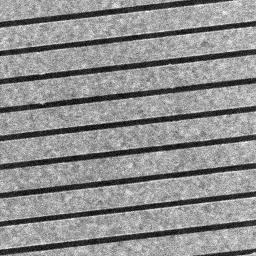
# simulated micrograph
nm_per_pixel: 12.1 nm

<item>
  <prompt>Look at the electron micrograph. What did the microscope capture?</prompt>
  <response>parallel lines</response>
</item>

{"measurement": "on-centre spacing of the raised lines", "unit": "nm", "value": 343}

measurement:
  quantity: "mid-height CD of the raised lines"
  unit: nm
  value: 268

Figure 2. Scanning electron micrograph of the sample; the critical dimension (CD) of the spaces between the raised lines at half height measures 78.4 nm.